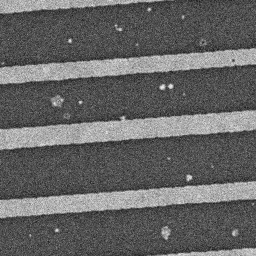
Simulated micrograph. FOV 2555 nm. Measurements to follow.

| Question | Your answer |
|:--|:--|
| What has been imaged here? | lines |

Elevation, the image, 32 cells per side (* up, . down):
***************.................
**..............................
................................
................................
................................
................................
...........................*****
..............******************
*************************.......
************....................
................................
................................
................................
................................
......................**********
..........**********************
****************************....
****************................
**..............................
................................
................................
................................
................................
......................**********
.........***********************
**********************..........
*********.......................
................................
................................
................................
................................
.........................*******